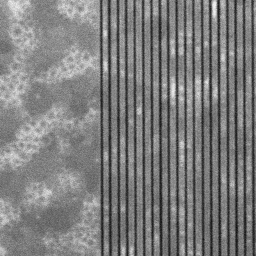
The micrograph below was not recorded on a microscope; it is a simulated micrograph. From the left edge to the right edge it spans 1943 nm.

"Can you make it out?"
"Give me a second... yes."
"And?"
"parallel lines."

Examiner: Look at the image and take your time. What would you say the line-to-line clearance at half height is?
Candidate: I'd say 24.7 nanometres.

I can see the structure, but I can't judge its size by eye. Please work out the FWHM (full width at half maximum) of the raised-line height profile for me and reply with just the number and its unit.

38.9 nanometers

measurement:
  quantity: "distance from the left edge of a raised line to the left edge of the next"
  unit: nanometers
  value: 63.8